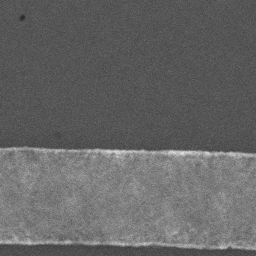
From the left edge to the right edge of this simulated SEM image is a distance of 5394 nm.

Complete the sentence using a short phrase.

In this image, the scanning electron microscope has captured one or a few lines or trenches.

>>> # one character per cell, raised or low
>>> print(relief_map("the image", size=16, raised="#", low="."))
................
................
................
................
................
................
................
................
................
########.#......
################
################
################
################
################
................